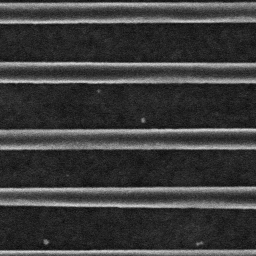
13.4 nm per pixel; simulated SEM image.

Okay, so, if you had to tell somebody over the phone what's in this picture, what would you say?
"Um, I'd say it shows lines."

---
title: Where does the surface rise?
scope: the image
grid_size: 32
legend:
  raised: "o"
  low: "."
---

................................
oooooooooooooooooooooooooooooooo
oooooooooooooooooooooooooooooooo
................................
................................
................................
................................
................................
oooooooooooooooooooooooooooooooo
oooooooooooooooooooooooooooooooo
................................
................................
................................
................................
................................
................................
o..ooooooooooooooooooooooooooooo
oooooooooooooooooooooooooooooooo
................................
................................
................................
................................
................................
................................
oooooooooooooooooooooooooooooooo
.....ooooooooooooooooooooooooooo
................................
................................
................................
................................
................................
....oo.....ooooooo.............o